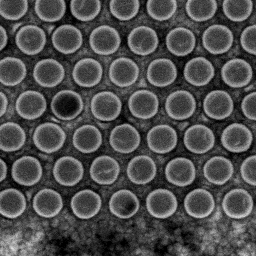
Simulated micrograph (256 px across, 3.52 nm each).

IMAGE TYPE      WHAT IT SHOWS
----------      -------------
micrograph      a regular array of raised bodies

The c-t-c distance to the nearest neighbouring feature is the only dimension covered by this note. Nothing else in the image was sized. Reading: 129 nm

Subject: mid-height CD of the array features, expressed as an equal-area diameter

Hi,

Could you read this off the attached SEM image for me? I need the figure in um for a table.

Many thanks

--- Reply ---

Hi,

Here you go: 0.0999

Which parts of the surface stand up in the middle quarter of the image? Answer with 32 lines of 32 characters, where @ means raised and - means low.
---@@@@@@---@@@@@@---@@@@@@----@
--@@@@@@@---@@@@@@---@@@@@@@--@@
--@@@@@@@---@@@@@@---@@@@@@@--@@
---@@@@@@---@@@@@@---@@@@@@@---@
---@@@@@----@@@@@@----@@@@@----@
-----@@-------------------------
--------------------------------
@@@------@@@-----@@@@@-----@@@@@
@@@@----@@@@@----@@@@@@---@@@@@@
@@@@---@@@@@@@--@@@@@@@---@@@@@@
@@@@---@@@@@@@--@@@@@@@---@@@@@@
@@@@---@@@@@@@---@@@@@@---@@@@@@
@@@----@@@@@@@---@@@@@@---@@@@@@
@@-------@@@@---------------@@--
--------------------------------
-----@@-------@@@------@@@------
---@@@@@----@@@@@@----@@@@@----@
---@@@@@@---@@@@@@@--@@@@@@@--@@
--@@@@@@@---@@@@@@@--@@@@@@@--@@
--@@@@@@@---@@@@@@@--@@@@@@@--@@
---@@@@@@---@@@@@@---@@@@@@@--@@
----@@@@-----@@@@-----@@@@@----@
--------------------------------
@@------@@@@------@@@-----------
@@@@---@@@@@@----@@@@@-----@@@@@
@@@@---@@@@@@---@@@@@@@---@@@@@@
@@@@@--@@@@@@@--@@@@@@@---@@@@@@
@@@@@--@@@@@@---@@@@@@@---@@@@@@
@@@@---@@@@@@---@@@@@@----@@@@@@
@@@-----@@@@-----@@@@------@@@@@
--------------------------------
--------------------------------